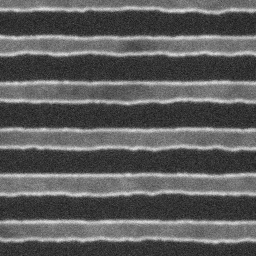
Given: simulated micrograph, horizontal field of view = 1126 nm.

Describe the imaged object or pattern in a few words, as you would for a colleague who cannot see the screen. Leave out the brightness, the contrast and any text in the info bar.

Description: lines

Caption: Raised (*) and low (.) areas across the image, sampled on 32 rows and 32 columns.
********************************
.........................***....
................................
................................
................................
********************************
********************************
................................
................................
................................
********************************
********************************
********************************
................................
................................
................................
********************************
********************************
..*..********..*******..**.*****
................................
................................
................................
********************************
********************************
................................
................................
................................
................................
********************************
********************************
................................
................................